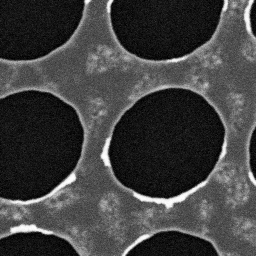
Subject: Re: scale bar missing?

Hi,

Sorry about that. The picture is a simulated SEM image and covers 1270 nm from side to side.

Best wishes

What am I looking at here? holes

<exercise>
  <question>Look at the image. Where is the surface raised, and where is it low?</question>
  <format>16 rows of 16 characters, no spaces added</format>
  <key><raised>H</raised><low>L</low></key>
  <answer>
LLLLLHHLLLLLLLHH
LLLLLHHLLLLLLLHH
LLLLHHHLLLLLLHHH
LLLHHHHHHLLLHHHH
HHHHHHHHHHHHHHHH
HHHHHHHHHHHHHHHH
LLLLHHHHLLLLLHHH
LLLLLHHLLLLLLLHH
LLLLLHHLLLLLLLHH
LLLLLHHLLLLLLLHH
LLLLLHHLLLLLLHHH
LLLLHHHHLLLLHHHH
HLHHHHHHHHHHHHHH
HHHHHHHHHHHHHHHH
HHLHHHHHHHLHHHHH
LLLLLHHHLLLLLHHH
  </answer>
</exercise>